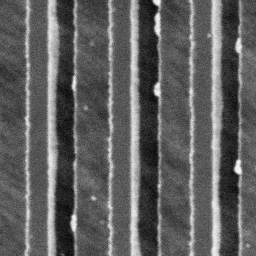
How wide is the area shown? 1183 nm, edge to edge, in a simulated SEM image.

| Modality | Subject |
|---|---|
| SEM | lines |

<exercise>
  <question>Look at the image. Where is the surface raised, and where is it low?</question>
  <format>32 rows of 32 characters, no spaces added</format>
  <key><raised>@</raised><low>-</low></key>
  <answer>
@@@@@@---@@@@@@@@--@@@@@@@@---@@
@@@@@@---@@@@@@@@---@@@@@@@---@@
@@@@@@@--@@@@@@@@--@@@@@@@@---@@
@@@@@@@--@@@@@@@@--@@@@@@@@---@@
@@@@@@@--@@@@@@@@---@@@@@@@---@@
@@@@@@@--@@@@@@@@---@@@@@@@---@@
@@@@@@@--@@@@@@@@---@@@@@@@---@@
@@@@@@@--@@@@@@@@---@@@@@@@---@@
@@@@@@@--@@@@@@@@---@@@@@@@---@@
@@@@@@@--@@@@@@@@---@@@@@@@---@@
@@@@@@---@@@@@@@@---@@@@@@@---@@
@@@@@@---@@@@@@@@--@@@@@@@@---@@
@@@@@@---@@@@@@@@---@@@@@@@---@@
@@@@@@---@@@@@@@@---@@@@@@@---@@
@@@@@@---@@@@@@@@---@@@@@@@---@@
@@@@@@---@@@@@@@@---@@@@@@@---@@
@@@@@@---@@@@@@@@---@@@@@@@---@@
@@@@@@---@@@@@@@@---@@@@@@@---@@
@@@@@@---@@@@@@@@---@@@@@@@---@@
@@@@@@@---@@@@@@@---@@@@@@@---@@
@@@@@@@--@@@@@@@@---@@@@@@@--@@@
@@@@@@---@@@@@@@@---@@@@@@@---@@
@@@@@@---@@@@@@@@---@@@@@@@---@@
@@@@@@---@@@@@@@@---@@@@@@@---@@
@@@@@@---@@@@@@@@---@@@@@@@---@@
@@@@@@---@@@@@@@@---@@@@@@@---@@
@@@@@@---@@@@@@@@---@@@@@@@---@@
@@@@@@---@@@@@@@@---@@@@@@@---@@
@@@@@@---@@@@@@@@---@@@@@@@---@@
@@@@@@---@@@@@@@@---@@@@@@@---@@
@@@@@@---@@@@@@@@---@@@@@@@---@@
@@@@@@---@@@@@@@@---@@@@@@@---@@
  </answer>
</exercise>